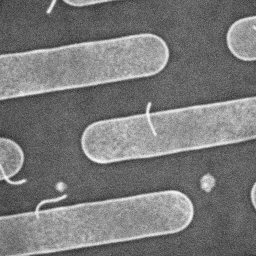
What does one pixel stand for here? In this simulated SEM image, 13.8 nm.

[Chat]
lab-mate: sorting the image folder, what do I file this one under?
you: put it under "groups of lines, slits or small figures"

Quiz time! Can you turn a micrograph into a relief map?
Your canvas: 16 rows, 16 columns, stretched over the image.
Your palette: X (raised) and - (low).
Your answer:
----------------
---------------X
-------XXX----XX
XXXXXXXXXX-----X
XXXXXXXXXX------
XXXX------------
-------------XXX
-------XXXXXXXXX
-----XXXXXXXXXXX
X----XXXXXX-----
X---------------
----------------
-------XXXXX----
-XXXXXXXXXXX----
XXXXXXXXXXX-----
XXXXX-----------